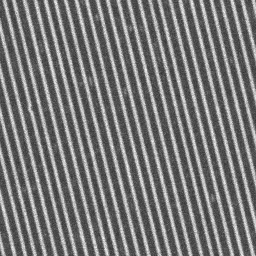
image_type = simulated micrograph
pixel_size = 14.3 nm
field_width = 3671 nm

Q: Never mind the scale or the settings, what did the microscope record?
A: parallel lines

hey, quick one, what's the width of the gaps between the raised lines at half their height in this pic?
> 110 nanometres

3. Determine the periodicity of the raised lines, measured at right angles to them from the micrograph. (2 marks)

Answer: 10.1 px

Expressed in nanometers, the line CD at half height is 41.8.